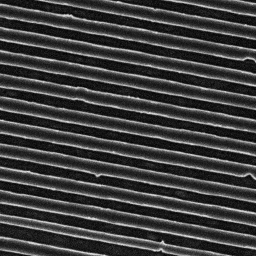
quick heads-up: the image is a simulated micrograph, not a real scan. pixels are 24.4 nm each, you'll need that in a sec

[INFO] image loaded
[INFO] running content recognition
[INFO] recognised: parallel lines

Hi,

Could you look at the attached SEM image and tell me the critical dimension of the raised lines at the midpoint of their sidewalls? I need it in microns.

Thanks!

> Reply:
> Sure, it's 0.306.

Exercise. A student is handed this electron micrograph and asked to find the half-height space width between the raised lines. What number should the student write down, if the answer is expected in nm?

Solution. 240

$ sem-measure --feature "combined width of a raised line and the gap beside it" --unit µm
0.556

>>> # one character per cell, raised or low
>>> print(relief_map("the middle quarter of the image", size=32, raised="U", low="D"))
UUUUUDDDDDDDDDDDDDDDDUUUUUUUUUUU
UUUUUUUUUUUDDDDDDDDDDDDDDDUUUUUU
UUUUUUUUUUUUUUUUDDDDDDDDDDDDDDDD
DDDDUUUUUUUUUUUUUUUUUDDDDDDDDDDD
DDDDDDDDDDUUUUUUUUUUUUUUUUUUDDDD
UDDDDDDDDDDDDDDDUUUUUUUUUUUUUUUU
UUUUUUDDDDDDDDDDDDDDDUUUUUUUUUUU
UUUUUUUUUUUUDDDDDDDDDDDDDDDUUUUU
DUUUUUUUUUUUUUUUUUDDDDDDDDDDDDDD
DDDDDDUUUUUUUUUUUUUUUUUDDDDDDDDD
DDDDDDDDDDUUUUUUUUUUUUUUUUUUDDDD
UUDDDDDDDDDDDDDDUUUUUUUUUUUUUUUU
UUUUUUUDDDDDDDDDDDDDDDUUUUUUUUUU
UUUUUUUUUUUUUDDDDDDDDDDDDDDUUUUU
UUUUUUUUUUUUUUUUUUDDDDDDDDDDDDDD
DDDDDDDUUUUUUUUUUUUUUUUUDDDDDDDD
DDDDDDDDDDDDUUUUUUUUUUUUUUUUUUDD
UUUDDDDDDDDDDDDDDDUUUUUUUUUUUUUU
UUUUUUUUDDDDDDDDDDDDDDDDUUUUUUUU
UUUUUUUUUUUUUUDDDDDDDDDDDDDDDUUU
DDUUUUUUUUUUUUUUUUUUDDDDDDDDDDDD
DDDDDDDUUUUUUUUUUUUUUUUUUDDDDDDD
DDDDDDDDDDDDDUUUUUUUUUUUUUUUUUUD
UUUUDDDDDDDDDDDDDDUUUUUUUUUUUUUU
UUUUUUUUUDDDDDDDDDDDDDDDUUUUUUUU
UUUUUUUUUUUUUUUDDDDDDDDDDDDDDUUU
DDDUUUUUUUUUUUUUUUUUDDDDDDDDDDDD
DDDDDDDDUUUUUUUUUUUUUUUUUUDDDDDD
DDDDDDDDDDDDDDUUUUUUUUUUUUUUUUUD
UUUUDDDDDDDDDDDDDDDDUUUUUUUUUUUU
UUUUUUUUUUUDDDDDDDDDDDDDDUUUUUUU
UUUUUUUUUUUUUUUDDDDDDDDDDDDDDDDU